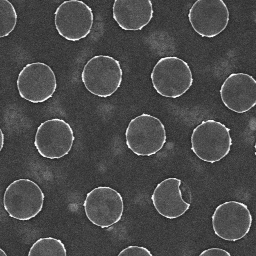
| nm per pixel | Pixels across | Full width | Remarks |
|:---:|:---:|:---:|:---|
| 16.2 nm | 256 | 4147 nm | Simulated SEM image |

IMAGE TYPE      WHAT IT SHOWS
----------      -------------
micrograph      a regular array of raised bodies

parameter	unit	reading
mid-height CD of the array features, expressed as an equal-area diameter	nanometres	642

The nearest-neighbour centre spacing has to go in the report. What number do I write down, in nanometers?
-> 1070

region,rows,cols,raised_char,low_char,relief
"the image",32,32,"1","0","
10000000111000111110000011110000
11000001111000111110000011110000
11000001111100111110000011111000
11000001111000011100000011110000
10000000111000000000000000100000
00000000000000000000000000000000
00000000000000000000000000000000
00000000000111000000111000000000
00011100000111100001111100000000
00111110001111100001111100000110
00111110000111100001111100001111
00111110000111000000111000001111
00001100000000000000000000001111
00000000000000000000000000000110
00000000000000000110000000000000
00000111000000001111000001110001
00000111100000001111100011111000
00001111100000001111100011111000
00000111100000001111000011111000
00000111000000000000000001110000
00000000000000000000000000000000
00000000000000000000000000000000
00000000000000000000010000000000
01111000000011000000110000000000
01111000000111100001111000000000
01111000000111100001111000001100
01111000000111100000111000011110
00000000000111100000000000011110
00000000000000000000000000011110
00000000000000000000000000011100
00001111000000000000000000000000
00001111000000011110000001110000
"